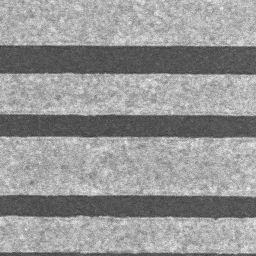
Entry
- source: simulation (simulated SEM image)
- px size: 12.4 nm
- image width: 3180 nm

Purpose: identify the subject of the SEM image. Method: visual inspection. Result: one or a few lines or trenches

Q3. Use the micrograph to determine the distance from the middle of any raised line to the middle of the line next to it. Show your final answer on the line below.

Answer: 873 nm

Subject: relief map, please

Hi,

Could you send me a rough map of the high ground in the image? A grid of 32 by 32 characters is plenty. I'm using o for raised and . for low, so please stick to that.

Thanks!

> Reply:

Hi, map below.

oooooooooooooooooooooooooooooooo
oooooooooooooooooooooooooooooooo
oooooooooooooooooooooooooooooooo
oooooooooooooooooooooooooooooooo
oooooooooooooooooooooooooooooooo
ooo...oooooooooooooooooooooooooo
................................
................................
................................
oooooooooooooooooooooooooooooooo
oooooooooooooooooooooooooooooooo
oooooooooooooooooooooooooooooooo
oooooooooooooooooooooooooooooooo
oooooooooooooooooooooooooooooooo
................................
................................
................................
oooooooooooooooooooooooooooooooo
oooooooooooooooooooooooooooooooo
oooooooooooooooooooooooooooooooo
oooooooooooooooooooooooooooooooo
oooooooooooooooooooooooooooooooo
oooooooooooooooooooooooooooooooo
oooooooooooooooooooooooooooooooo
..............................oo
................................
................................
oooooooooooooooooooooooooooooooo
oooooooooooooooooooooooooooooooo
oooooooooooooooooooooooooooooooo
oooooooooooooooooooooooooooooooo
..........oo..oooooooooooooooooo